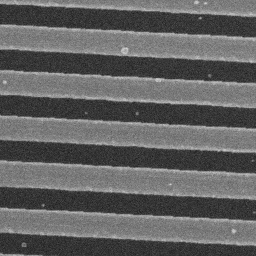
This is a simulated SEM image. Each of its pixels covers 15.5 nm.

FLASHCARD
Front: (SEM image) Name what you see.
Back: lines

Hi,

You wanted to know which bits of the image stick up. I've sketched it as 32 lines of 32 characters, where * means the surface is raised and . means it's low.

....****************************
........................********
................................
*****...........................
*************************.......
********************************
.............*******************
...............................*
................................
***********.....................
******************************..
********************************
................****************
................................
................................
******************..............
********************************
.......*************************
.......................*********
................................
*******.........................
**************************......
********************************
........************************
............................****
................................
*******.........................
***************************.....
********************************
..............******************
................................
................................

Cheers